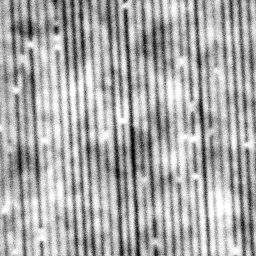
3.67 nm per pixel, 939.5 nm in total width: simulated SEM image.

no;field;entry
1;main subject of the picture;parallel lines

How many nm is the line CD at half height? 21.5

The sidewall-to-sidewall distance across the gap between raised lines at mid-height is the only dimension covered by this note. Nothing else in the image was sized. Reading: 12.4 nanometres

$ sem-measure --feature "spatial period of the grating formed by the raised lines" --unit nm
32.3